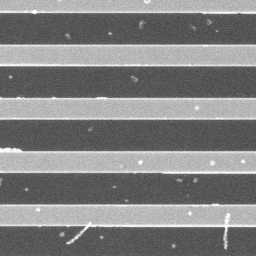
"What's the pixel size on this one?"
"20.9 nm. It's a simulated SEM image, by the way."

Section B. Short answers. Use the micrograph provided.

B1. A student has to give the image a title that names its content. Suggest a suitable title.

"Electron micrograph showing lines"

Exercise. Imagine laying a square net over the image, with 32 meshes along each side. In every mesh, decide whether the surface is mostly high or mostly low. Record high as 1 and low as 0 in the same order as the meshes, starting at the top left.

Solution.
11111111111111111111111111111111
11111111111111111111111111111111
00000000000000000000000000000000
00000000000000000000000000000000
00000000000000000000000000000000
00000000000000000000000000000000
11111111111111111111111111111111
11111111111111111111111111111111
00000000000000000000000000000000
00000000000000000000000000000000
00000000000000000000000000000000
00000000000000000000000000000000
11111111111111111111111111111111
11111111111111111111111111111111
11111111111111111111111111111111
00000000000000000000000000000000
00000000000000000000000000000000
00000000000000000000000000000000
00000000000000000000000000000000
11111111111111111111111111111111
11111111111111111111111111111111
11111111111111111111111111111111
00000000000000000000000000000000
00000000000000000000000000000000
00000000000000000000000000000000
00000000000000000000000000000000
11111111111111111111111111111111
11111111111111111111111111111111
00000000000000000000000000000000
00000000000000000000000000000000
00000000000000000000000000000000
00000000000000000000000000000000